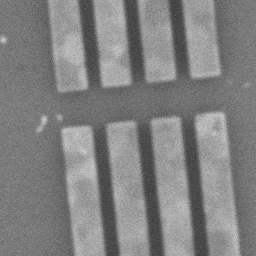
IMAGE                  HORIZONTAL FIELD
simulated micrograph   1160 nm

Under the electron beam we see groups of lines, slits or small figures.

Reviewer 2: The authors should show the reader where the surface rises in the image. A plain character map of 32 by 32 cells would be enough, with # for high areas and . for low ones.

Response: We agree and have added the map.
......####..###..####..####.....
......####..###..####..####.....
......####..####.####..####.....
.......###..####..###..####.....
.......###..####..###..####.....
.......###..####..####.####.....
.......###..####..####..###.....
.......####.####..####..###.....
.......####..###..####..###.....
.......####..###..####..##......
.......####..###................
................................
................................
................................
.........................###....
...............##..###..####....
........###..####..####..###....
........####..###..####..###....
........####..###..####..###....
........####..###..####..####...
........####..###..####..####...
........####..####..###..####...
........####..####..###..####...
.........###..####..###..####...
.........###..####..####.####...
.........###..####..####..###...
.........###...###..####..###...
.........####..###..####..###...
.........####..###..####..###...
.........####..###..####..####..
.........####..####.####..####..
.........####..####..###..####..